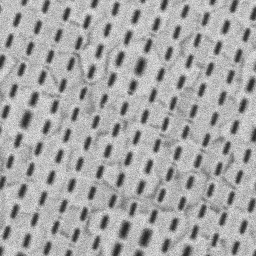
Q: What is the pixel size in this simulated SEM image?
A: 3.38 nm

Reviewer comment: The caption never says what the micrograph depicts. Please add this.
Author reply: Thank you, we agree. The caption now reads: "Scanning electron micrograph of a regular array of holes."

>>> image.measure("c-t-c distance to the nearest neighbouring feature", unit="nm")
72.9